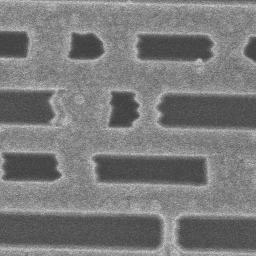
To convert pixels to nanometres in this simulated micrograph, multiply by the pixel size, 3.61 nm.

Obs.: parallel lines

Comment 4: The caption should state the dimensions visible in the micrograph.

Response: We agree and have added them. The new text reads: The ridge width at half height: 119 nanometers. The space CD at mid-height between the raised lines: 119 nm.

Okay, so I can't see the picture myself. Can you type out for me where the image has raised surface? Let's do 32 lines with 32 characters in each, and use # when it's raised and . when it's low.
################################
################################
################################
################################
...######...######.......#######
...######....####..........####.
...######....####.........#####.
######################..#.######
################################
################################
################################
......##########################
......########...###............
.......#######...###............
.......#######...###............
#.....########..####............
################################
################################
################################
#......#####....################
.......#####..............######
#......#####..............######
#......#####..............######
################################
################################
################################
.###############################
....................##..........
....................##..........
....................##..........
....................##..........
################################